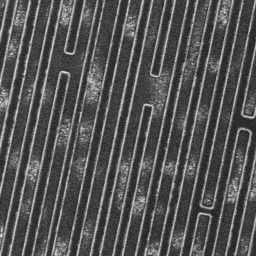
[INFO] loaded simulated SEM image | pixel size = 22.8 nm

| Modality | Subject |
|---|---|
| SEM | parallel lines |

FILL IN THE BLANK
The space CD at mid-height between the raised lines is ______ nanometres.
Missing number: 290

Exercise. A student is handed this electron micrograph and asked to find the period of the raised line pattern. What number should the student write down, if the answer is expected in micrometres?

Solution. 0.503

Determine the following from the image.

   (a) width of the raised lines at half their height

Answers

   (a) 212 nanometers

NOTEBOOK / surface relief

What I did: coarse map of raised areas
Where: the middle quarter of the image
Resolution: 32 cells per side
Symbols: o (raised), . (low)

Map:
.....oo....oo....oo...oo....oo..
.....oo...ooo...oo....oo....oo..
o....o....ooo...oo....oo...ooo..
o...oo....oo....oo.........oo...
o...oo....oo....oo.........oo...
o...oo....oo...ooo.........oo...
o...o....ooo...ooo........ooo...
....o....ooo...oo.........ooo...
...oo....oo....oo.........oo....
...oo....oo....oo.........oo...o
...oo....oo...ooo...oo....oo...o
...o....ooo...ooo...oo...ooo...o
...o....oo....oo....oo...ooo...o
..oo....oo....oo...ooo...oo....o
..oo....oo....oo...ooo...oo...oo
..oo....oo...ooo...oo....oo...oo
..o....ooo...oo....oo...ooo...oo
..o....oo....oo....oo...ooo...oo
.oo....oo....oo...ooo...oo....oo
.oo....oo...ooo...oo....oo...ooo
.oo....oo...ooo...oo....oo...oo.
.o....ooo...oo....oo...ooo...oo.
.o....oo....oo....oo...oo....oo.
oo....oo....oo...ooo...oo....oo.
oo....oo....oo...oo....oo...ooo.
oo....oo...oo....oo....oo...oo..
o....ooo...oo....oo...ooo...oo..
o....oo....oo....oo...oo....oo..
o....oo....oo...ooo...oo....oo..
o....oo....oo...oo....oo...ooo..
o....oo...ooo...oo....oo...oo...
....ooo...oo....oo...ooo...oo...